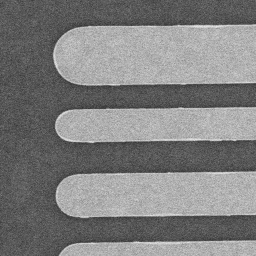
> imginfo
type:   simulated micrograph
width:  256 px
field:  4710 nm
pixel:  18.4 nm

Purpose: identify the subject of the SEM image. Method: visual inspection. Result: groups of lines, slits or small figures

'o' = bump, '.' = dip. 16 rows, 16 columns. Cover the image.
................
................
....oooooooooooo
...ooooooooooooo
....oooooooooooo
................
................
....oooooooooooo
....oooooooooooo
................
................
....oooooooooooo
....oooooooooooo
.....oo.........
................
....oooooooooooo